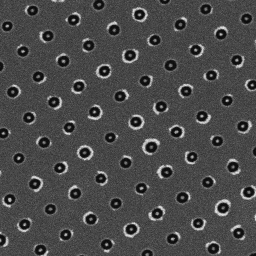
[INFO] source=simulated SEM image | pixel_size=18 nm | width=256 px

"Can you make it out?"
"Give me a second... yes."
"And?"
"a regular array of ring-shaped grooves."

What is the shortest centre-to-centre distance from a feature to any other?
29.5 px